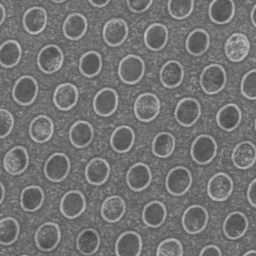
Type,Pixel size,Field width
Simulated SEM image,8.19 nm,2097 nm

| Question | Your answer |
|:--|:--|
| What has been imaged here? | a regular array of raised bodies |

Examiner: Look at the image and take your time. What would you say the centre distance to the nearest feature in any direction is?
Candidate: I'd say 330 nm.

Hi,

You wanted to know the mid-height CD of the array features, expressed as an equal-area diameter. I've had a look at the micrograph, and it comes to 203 nanometers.